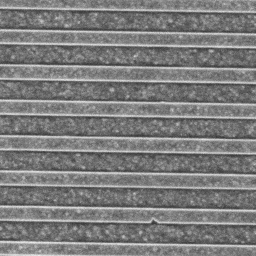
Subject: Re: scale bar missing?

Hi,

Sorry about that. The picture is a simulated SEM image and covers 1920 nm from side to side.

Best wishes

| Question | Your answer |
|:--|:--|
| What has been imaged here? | parallel lines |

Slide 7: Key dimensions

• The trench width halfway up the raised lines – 157 nanometres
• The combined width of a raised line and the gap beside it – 264 nm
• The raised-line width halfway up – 105 nm